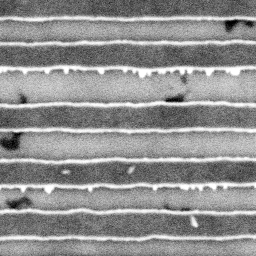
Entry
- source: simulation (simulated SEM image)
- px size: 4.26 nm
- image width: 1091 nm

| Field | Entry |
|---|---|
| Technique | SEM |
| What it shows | lines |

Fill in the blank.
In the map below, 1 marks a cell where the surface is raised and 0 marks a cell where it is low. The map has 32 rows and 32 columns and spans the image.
11111111111111111111111111111111
11111111111111111111111111111111
00111100000000011000000000000000
00000000000000000000000000000000
00000000000000000000000000000000
11111111111111111111111111111111
11111111111111111111111111111111
11111111111111111111111111111111
11111111111111111111111111111111
00000000000000000000000000000000
00000000000000000000000000000000
00000000000000000000000000000000
00000000000000000000000000000000
11111111111111111111111111111111
11111111111111111111111111111111
11111111111111111111111111111111
00000000000000001000000000000000
00000000000000000000000000000000
00000000000000000000000000000000
00000000000000000000000000000000
11111111111111111111111111111111
11111111111111111111111111111111
11111111111111111111111111111111
00000000000000000000000000000000
00000000000000000000000000000000
00000000000000000000000000000000
11111100111101111111110010000000
11111111111111111111111111111111
11111111111111111111111111111111
11111111111111111111111111111111
00000000000000000000000000000000
00000000000000000000000000000000